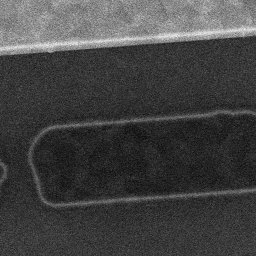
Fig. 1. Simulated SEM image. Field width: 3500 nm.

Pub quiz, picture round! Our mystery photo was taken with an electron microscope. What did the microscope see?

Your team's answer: one or a few lines or trenches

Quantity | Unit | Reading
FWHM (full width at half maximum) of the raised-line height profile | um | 1.07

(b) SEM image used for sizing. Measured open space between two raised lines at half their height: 1110 nm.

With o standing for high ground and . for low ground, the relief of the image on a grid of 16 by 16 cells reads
oooooooooooooooo
oooooooooooooooo
ooooooo.........
................
................
................
................
.........ooooooo
..oooooooooooooo
..oooooooooooooo
..oooooooooooooo
..oooooooooooooo
...ooooo........
................
................
................